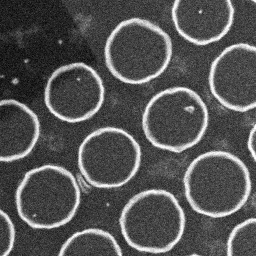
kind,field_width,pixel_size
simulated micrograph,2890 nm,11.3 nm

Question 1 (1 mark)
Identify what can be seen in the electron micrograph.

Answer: raised bodies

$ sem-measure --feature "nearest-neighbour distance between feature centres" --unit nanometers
840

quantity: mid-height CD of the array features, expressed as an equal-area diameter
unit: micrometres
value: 0.69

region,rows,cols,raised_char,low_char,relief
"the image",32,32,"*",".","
......................*******...
......................*******...
......................*******...
...............****...******....
..............*******..*****....
..............*******...........
.............********.......****
..............*******......*****
........***...******.......*****
.......*****...****.......******
......*******.............******
......*******........***...*****
......*******......******...****
***...******......********...**.
****...****.......********......
*****.............********......
*****.......***...*******.......
****.......******..******......*
****......*******....**........*
***.......*******........****...
..........*******.......******..
....****..*******.......*******.
...******..*****.......********.
...*******.............********.
..********........***...*******.
..********......******..******..
...******.......*******..****...
*..*****.......********.........
*..............********.......**
**.......*****..******.......***
*.......******..******.......***
*.......*******..............***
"